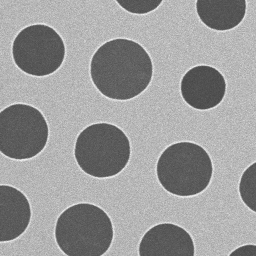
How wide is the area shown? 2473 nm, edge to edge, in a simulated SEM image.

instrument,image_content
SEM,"holes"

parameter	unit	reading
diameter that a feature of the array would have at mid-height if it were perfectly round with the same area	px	55.2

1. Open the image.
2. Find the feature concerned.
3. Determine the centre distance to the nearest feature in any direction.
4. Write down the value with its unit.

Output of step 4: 809 nanometers